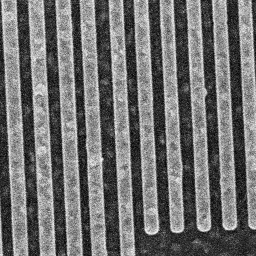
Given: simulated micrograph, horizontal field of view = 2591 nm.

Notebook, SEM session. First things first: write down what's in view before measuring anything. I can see parallel lines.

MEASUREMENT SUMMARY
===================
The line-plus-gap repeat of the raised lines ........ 0.266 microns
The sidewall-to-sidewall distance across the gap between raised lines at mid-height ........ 132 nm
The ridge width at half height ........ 13.1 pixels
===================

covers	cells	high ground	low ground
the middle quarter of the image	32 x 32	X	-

XX---XXX----XXX---XXXX---XXX----
XX---XXX----XXX---XXXX---XXX----
XX---XXX----XXX----XXX---XXX----
XX---XXX----XXX----XXX---XXX----
XX---XXX----XXX----XXX---XXX----
XX---XXX----XXX----XXX---XXX----
XXX--XXX----XXXX---XXX---XXX----
XXX--XXX-----XXX---XXX---XXX----
XXX--XXX-----XXX---XXX---XXX----
XXX--XXXX----XXX---XXX---XXX----
XXX---XXX----XXX---XXX----XX----
XXX---XXX----XXX---XXX----XX----
XXX---XXX----XXX---XXX----XX----
XXX---XXX----XXX---XXX----XX----
XXX---XXX----XXX---XXX----XXX---
XXX---XXX----XXX---XXX----XXX---
XXX---XXX----XXX---XXX----XXX---
XXX---XXX----XXX---XXX----XXX---
XXX---XXX----XXX---XXX----XXX---
XXX---XXX----XXX---XXX----XXX---
XXX---XXX----XXX---XXXX---XXX---
XXX---XXX----XXX----XXX---XXX---
XXX---XXX----XXX----XXX---XXX---
XXX---XXX----XXX----XXX---XXX---
XXX---XXX----XXX----XXX---XXX---
XXX---XXX----XXX----XXX---XXX---
XXX---XXX----XXX----XXX---XXX---
XXXX--XXX----XXXX---XXX---XXX---
XXXX--XXX-----XXX---XXX---XXX---
XXXX--XXX-----XXX---XXX---XXX---
XXXX--XXXX----XXX---XXX---XXX---
XXXX--XXXX----XXX---XXX---XXX---